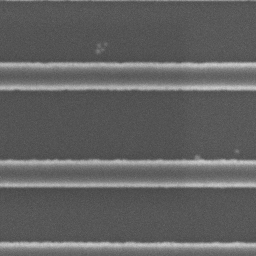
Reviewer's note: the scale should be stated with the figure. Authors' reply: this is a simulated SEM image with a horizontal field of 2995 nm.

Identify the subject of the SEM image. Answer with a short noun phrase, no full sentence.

lines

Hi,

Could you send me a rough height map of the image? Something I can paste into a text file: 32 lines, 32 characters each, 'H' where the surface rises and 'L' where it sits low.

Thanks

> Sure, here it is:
LLLLLLLLLLLLLLLLLLLLLLLLLLLLLLLL
LLLLLLLLLLLLLLLLLLLLLLLLLLLLLLLL
LLLLLLLLLLLLLLLLLLLLLLLLLLLLLLLL
LLLLLLLLLLLLLLLLLLLLLLLLLLLLLLLL
LLLLLLLLLLLLLLLLLLLLLLLLLLLLLLLL
LLLLLLLLLLLLLLLLLLLLLLLLLLLLLLLL
LLLLLLLLLLLLLLLLLLLLLLLLLLLLLLLL
LLLLLLLLLLLLLLLLLLLLLLLLLLLLLLLL
HHHHHHHHHHHHHHHHHHHHHHHHHHHHHHHH
HHHHHHHHHHHHHHHHHHHHHHHHHHHHHHHH
HHHHHHHHHHHHHHHHHHHHHHHHHHHHHHHH
LLLLLLLLLLLLLLLLLLLLLLLLLLLLLLLL
LLLLLLLLLLLLLLLLLLLLLLLLLLLLLLLL
LLLLLLLLLLLLLLLLLLLLLLLLLLLLLLLL
LLLLLLLLLLLLLLLLLLLLLLLLLLLLLLLL
LLLLLLLLLLLLLLLLLLLLLLLLLLLLLLLL
LLLLLLLLLLLLLLLLLLLLLLLLLLLLLLLL
LLLLLLLLLLLLLLLLLLLLLLLLLLLLLLLL
LLLLLLLLLLLLLLLLLLLLLLLLLLLLLLLL
LLLLLLLLLLLLLLLLLLLLLLLLLLLLLLLL
HHHHHHHHHHHHHHHHHHHHHHHHHHHHHHHH
HHHHHHHHHHHHHHHHHHHHHHHHHHHHHHHH
HHHHHHHHHHHHHHHHHHHHHHHHHHHHHHHH
LLLLLLLLLLLLLLLLLLLLLLLLLLLLLLLL
LLLLLLLLLLLLLLLLLLLLLLLLLLLLLLLL
LLLLLLLLLLLLLLLLLLLLLLLLLLLLLLLL
LLLLLLLLLLLLLLLLLLLLLLLLLLLLLLLL
LLLLLLLLLLLLLLLLLLLLLLLLLLLLLLLL
LLLLLLLLLLLLLLLLLLLLLLLLLLLLLLLL
LLLLLLLLLLLLLLLLLLLLLLLLLLLLLLLL
HHHHHHHHHHHHHHHHHHLHHHLLLHHHLHHL
HHHHHHHHHHHHHHHHHHHHHHHHHHHHHHHH